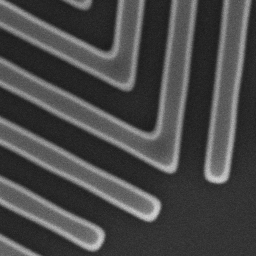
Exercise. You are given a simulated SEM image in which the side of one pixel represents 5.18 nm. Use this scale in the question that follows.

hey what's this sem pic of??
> groups of lines, slits or small figures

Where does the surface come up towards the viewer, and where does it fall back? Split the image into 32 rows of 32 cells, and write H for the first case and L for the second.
HLLLLLLLLHHLLLLHHHLLLLHHLLLLHHHL
HHHLLLLLLLLLLLLHHHLLLLHHLLLLHHHL
HHHHHLLLLLLLLLLHHHLLLHHHLLLLHHHL
LHHHHHLLLLLLLLLHHLLLLHHHLLLLHHHL
LLLHHHHHLLLLLLLHHLLLLHHHLLLLHHHL
LLLLLHHHHHLLLLHHHLLLLHHHLLLLHHLL
LLLLLLLHHHHHLLHHHLLLLHHHLLLLHHLL
LLLLLLLLHHHHHHHHHLLLLHHHLLLHHHLL
HHLLLLLLLLHHHHHHHLLLLHHHLLLHHHLL
HHHHLLLLLLLLHHHHHLLLLHHLLLLHHHLL
HHHHHHLLLLLLLLHHLLLLHHHLLLLHHHLL
LLHHHHHHLLLLLLLLLLLLHHHLLLLHHHLL
LLLLHHHHHHLLLLLLLLLLHHHLLLLHHLLL
LLLLLLHHHHHHLLLLLLLLHHHLLLLHHLLL
LLLLLLLLHHHHHLLLLLLLHHHLLLLHHLLL
HLLLLLLLLLHHHHHLLLLLHHHLLLHHHLLL
HHHLLLLLLLLLHHHHHLLLHHLLLLHHHLLL
HHHHHLLLLLLLLLHHHHHHHHLLLLHHHLLL
LHHHHHHLLLLLLLLLHHHHHHLLLLHHHLLL
LLLHHHHHHLLLLLLLLHHHHHLLLLHHHLLL
LLLLLHHHHHHLLLLLLLLHHHLLLLHHHLLL
LLLLLLLHHHHHHLLLLLLLLLLLLLHHLLLL
LLLLLLLLLHHHHHHLLLLLLLLLLLLHLLLL
HHHLLLLLLLLHHHHHHLLLLLLLLLLLLLLL
HHHHLLLLLLLLLHHHHHHLLLLLLLLLLLLL
HHHHHHLLLLLLLLLHHHHHLLLLLLLLLLLL
LLHHHHHHLLLLLLLLLHHHLLLLLLLLLLLL
LLLLHHHHHHLLLLLLLLLLLLLLLLLLLLLL
LLLLLLLHHHHHLLLLLLLLLLLLLLLLLLLL
LLLLLLLLHHHHHLLLLLLLLLLLLLLLLLLL
HHLLLLLLLLHHLLLLLLLLLLLLLLLLLLLL
HHHHLLLLLLLLLLLLLLLLLLLLLLLLLLLL